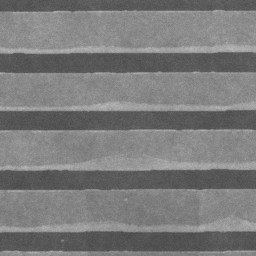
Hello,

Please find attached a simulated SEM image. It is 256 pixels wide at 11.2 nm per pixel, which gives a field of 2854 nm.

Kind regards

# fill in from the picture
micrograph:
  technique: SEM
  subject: lines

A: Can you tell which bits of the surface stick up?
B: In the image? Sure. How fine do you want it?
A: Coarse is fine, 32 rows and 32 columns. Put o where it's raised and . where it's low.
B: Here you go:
................................
......oooooooooooooooooooooooooo
oooooooooooooooooooooooooooooooo
oooooooooooooooooooooooooooooooo
oooooooooooooooooooooooooooooooo
oooooooooooooooooooooooooooooooo
...ooooo........................
................................
................................
oooooooooooooooooooooooooooooooo
oooooooooooooooooooooooooooooooo
oooooooooooooooooooooooooooooooo
oooooooooooooooooooooooooooooooo
oooooooooooooo....oooooooooooo..
................................
................................
oooooooooooooooooooooooooooooooo
oooooooooooooooooooooooooooooooo
oooooooooooooooooooooooooooooooo
oooooooooooooooooooooooooooooooo
oooooooooooooooooooooooooooooooo
................................
................................
................................
oooooooooooooooooooooooooooooooo
oooooooooooooooooooooooooooooooo
oooooooooooooooooooooooooooooooo
oooooooooooooooooooooooooooooooo
oooooooooooooooooooooooooooo..oo
................................
................................
ooo...oo.....oooo...........oooo